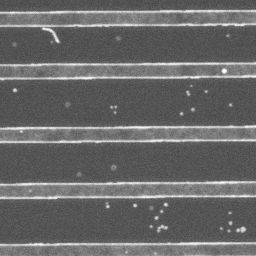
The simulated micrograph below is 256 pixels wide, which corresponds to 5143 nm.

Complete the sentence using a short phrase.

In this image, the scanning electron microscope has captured lines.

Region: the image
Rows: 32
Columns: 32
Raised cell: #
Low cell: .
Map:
................................
.......#########################
################################
................................
................................
................................
................................
................................
################################
################################
................................
................................
................................
................................
................................
................................
################################
################################
................................
................................
................................
................................
................................
################################
################################
................................
................................
................................
................................
................................
........................########
################################